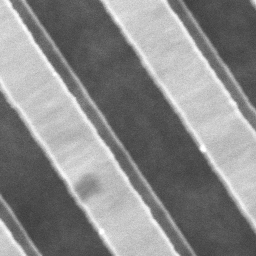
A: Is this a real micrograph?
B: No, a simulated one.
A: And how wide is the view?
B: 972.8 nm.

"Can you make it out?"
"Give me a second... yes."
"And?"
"lines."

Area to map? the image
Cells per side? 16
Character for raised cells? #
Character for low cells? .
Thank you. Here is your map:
##.....#####....
##.....#####....
###.....#####...
####.....#####..
####.....#####..
#####.....#####.
.#####.....#####
..#####.....####
..#####.....####
...#####.....###
....#####....###
....#####.....##
.....#####.....#
#.....#####....#
##....#####.....
##.....#####....